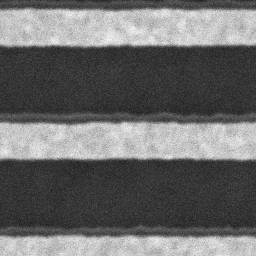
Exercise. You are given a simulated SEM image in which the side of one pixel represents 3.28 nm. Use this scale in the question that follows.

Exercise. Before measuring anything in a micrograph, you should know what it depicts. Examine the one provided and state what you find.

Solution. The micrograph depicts lines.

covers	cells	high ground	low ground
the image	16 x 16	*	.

****************
****************
****************
................
................
................
................
****************
****************
****************
................
................
................
................
****************
****************